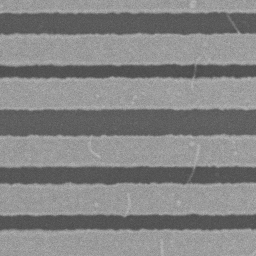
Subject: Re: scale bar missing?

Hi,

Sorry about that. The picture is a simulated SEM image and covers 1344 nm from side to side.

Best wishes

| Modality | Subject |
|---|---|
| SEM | lines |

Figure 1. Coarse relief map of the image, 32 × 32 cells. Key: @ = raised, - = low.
@@@@@@@@@@@@@@@@@@@@@@@@@@@@@@@@
@@@@@@@@@@@@@@@@@@@@@@@@@@@@@@@@
--------------------------------
--------------------------------
@@@@@@@@@@@@@@@@@@@@@@@@@@@@@@@@
@@@@@@@@@@@@@@@@@@@@@@@@@@@@@@@@
@@@@@@@@@@@@@@@@@@@@@@@@@@@@@@@@
@@@@@@@@@@@@@@@@@@@@@@@@@@@@@@@@
--------------------------------
--------------------------------
@@@@@@@@@@@@@@@@@@@@@@@@@@@@@@@@
@@@@@@@@@@@@@@@@@@@@@@@@@@@@@@@@
@@@@@@@@@@@@@@@@@@@@@@@@@@@@@@@@
@@@@@@@@@@@@@@@@@@@@@@@@@@@@@@@@
--------------------------------
--------------------------------
--------------------------------
@@@@@@@@@@@@@@@@@@@@@@@@@@@@@@@@
@@@@@@@@@@@@@@@@@@@@@@@@@@@@@@@@
@@@@@@@@@@@@@@@@@@@@@@@@@@@@@@@@
@@@@@@@@@@@@@@@@@@@@@@@@@@@@@@@@
--------------------------------
--------------------------------
@@@@@@@@@@@@@@@@@@@@@@@@@@@@@@@@
@@@@@@@@@@@@@@@@@@@@@@@@@@@@@@@@
@@@@@@@@@@@@@@@@@@@@@@@@@@@@@@@@
@@@@@@@@@@@@@@@@@@@@@@@@@@@@@@@@
--------------------------------
--------------------------------
@@@@@@@@@@@@@@@@@@@@@@@@@@@@@@@@
@@@@@@@@@@@@@@@@@@@@@@@@@@@@@@@@
@@@@@@@@@@@@@@@@@@@@@@@@@@@@@@@@